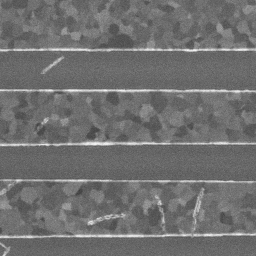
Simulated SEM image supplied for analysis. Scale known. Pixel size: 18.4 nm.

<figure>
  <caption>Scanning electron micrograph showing lines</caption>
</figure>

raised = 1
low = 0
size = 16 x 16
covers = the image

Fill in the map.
1111111111111111
1111111111111111
1111111111111111
0000000000000000
0000000000000000
0000000000000000
1111111111111111
1111111111111111
1111111111111111
0000000000000000
0000000000000000
1111111111111111
1111111111111111
1111111111111111
1111111111111111
0000000000000000